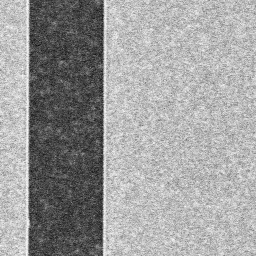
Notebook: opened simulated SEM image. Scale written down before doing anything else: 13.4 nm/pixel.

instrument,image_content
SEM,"one or a few lines or trenches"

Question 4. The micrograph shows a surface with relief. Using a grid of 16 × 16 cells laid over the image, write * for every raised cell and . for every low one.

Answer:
**.....*********
**.....*********
**.....*********
**.....*********
**.....*********
**.....*********
**.....*********
**.....*********
**.....*********
**.....*********
**.....*********
**.....*********
**.....*********
**.....*********
**.....*********
**.....*********